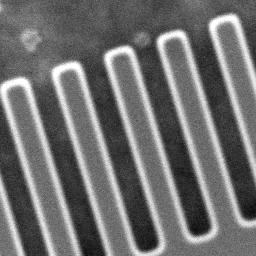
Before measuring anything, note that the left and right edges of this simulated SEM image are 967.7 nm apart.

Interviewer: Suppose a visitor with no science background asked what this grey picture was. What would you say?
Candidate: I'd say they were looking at groups of lines, slits or small figures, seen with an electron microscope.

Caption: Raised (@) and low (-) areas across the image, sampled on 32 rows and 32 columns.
--------------------------------
--------------------------------
---------------------------@@---
---------------------------@@@--
---------------------@@----@@@--
--------------------@@@----@@@@-
--------------@@----@@@@---@@@@-
-------------@@@@---@@@@----@@@-
--------@@----@@@----@@@----@@@-
-------@@@----@@@----@@@@---@@@@
-@@----@@@@---@@@@---@@@@---@@@@
@@@@---@@@@---@@@@----@@@----@@@
-@@@----@@@----@@@----@@@----@@@
-@@@----@@@----@@@@---@@@@---@@@
-@@@@---@@@@---@@@@----@@@----@@
-@@@@----@@@----@@@----@@@----@@
--@@@----@@@----@@@@---@@@@---@@
--@@@@---@@@@---@@@@---@@@@----@
--@@@@---@@@@----@@@----@@@----@
---@@@----@@@----@@@----@@@@---@
---@@@@---@@@@---@@@@---@@@@---@
---@@@@---@@@@----@@@----@@@----
----@@@----@@@----@@@----@@@----
----@@@----@@@@---@@@@---@@@@---
@---@@@@---@@@@---@@@@----@@@---
@---@@@@----@@@----@@@----@@@---
@----@@@----@@@----@@@@---@@@@--
@----@@@@---@@@@---@@@@----@@@--
@@---@@@@---@@@@----@@@----@@@@@
@@----@@@----@@@----@@@@--@@@@@@
@@----@@@@---@@@@---@@@@@@@@@@@@
@@@---@@@@---@@@@--@@@@@@@@@@@@@